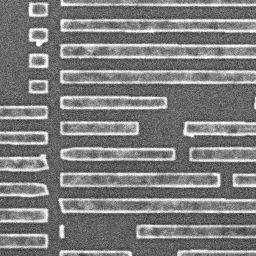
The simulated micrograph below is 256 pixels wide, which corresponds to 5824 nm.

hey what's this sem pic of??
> wiring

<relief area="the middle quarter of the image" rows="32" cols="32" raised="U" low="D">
DDDDDDDDDDDDDDDDDDDDDDDDDDDDDDDD
DDDDDDDDDDDDDDDDDDDDDDDDDDDDDDDD
UUUUUUUUUUUUUUUUUUUUUUUUUUUUUUUU
UUUUUUUUUUUUUUUUUUUUUUUUUUUUUUUU
UUUUUUUUUUUUUUUUUUUUUUUUUUUUUUUU
DDDDDDDDDDDDDDDDDDDDDDDDDDDDDDDD
DDDDDDDDDDDDDDDDDDDDDDDDDDDDDDDD
DDDDDDDDDDDDDDDDDDDDDDDDDDDDDDDD
UUUUUUUUUUUUUUUUDDDDDDDDDDDDDDDD
UUUUUUUUUUUUUUUUUUUUUUUUUDDDDDDD
UUUUUUUUUUUUUUUUUUUUUUUUUDDDDDDD
DDDDDDDDDDDDDDDDDDDDDDDDDDDDDDDD
DDDDDDDDDDDDDDDDDDDDDDDDDDDDDDDD
DDDDDDDDDDDDDDDDDDDDDDDDDDDDDDDD
DDDDDDDDDDDDDDDDDDDDDDDDDDDDDDDD
UUUUUUUUUUUUUUUUUUDDDDDDDDDDDDUU
UUUUUUUUUUUUUUUUUUDDDDDDDDDDDDUU
DDDDDDDDDDDDDDDDDDDDDDDDDDDDDDUU
DDDDDDDDDDDDDDDDDDDDDDDDDDDDDDDD
DDDDDDDDDDDDDDDDDDDDDDDDDDDDDDDD
DDDDDDDDDDDDDDDDDDDDDDDDDDDDDDDD
UUUUUUUUUUUUUUUUUUUUUUUUUUUDDDDD
UUUUUUUUUUUUUUUUUUUUUUUUUUUDDDDD
UUUUUUUUUUUUUUUUUUUUUUUUUUUDDDDD
DDDDDDDDDDDDDDDDDDDDDDDDDDDDDDDD
DDDDDDDDDDDDDDDDDDDDDDDDDDDDDDDD
DDDDDDDDDDDDDDDDDDDDDDDDDDDDDDDD
DDDDDDDDDDDDDDDDDDDDDDDDDDDDDDDD
UUUUUUUUUUUUUUUUUUUUUUUUUUUUUUUU
UUUUUUUUUUUUUUUUUUUUUUUUUUUUUUUU
DDDDDDDDDDDDDDDDDDDDDDDDDDDDDDDD
DDDDDDDDDDDDDDDDDDDDDDDDDDDDDDDD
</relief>